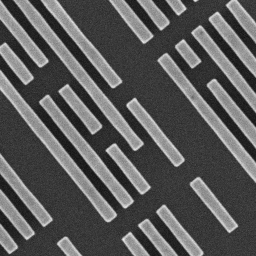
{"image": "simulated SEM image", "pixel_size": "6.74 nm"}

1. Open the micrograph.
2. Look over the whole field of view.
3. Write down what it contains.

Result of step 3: groups of lines, slits or small figures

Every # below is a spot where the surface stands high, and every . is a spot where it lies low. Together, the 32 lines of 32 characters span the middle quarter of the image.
.###....####............####...#
.####...####.............####...
..####...####.............####..
...####...####.............####.
....####...###..............###.
#....###....#...............####
##...####....................###
###...####....................##
####...####....................#
.####...####....###.............
.####...####....###.............
..####...####...####............
...####...####...####...........
#...####...####...####..........
#....####...####...####.........
##...####...####....###.........
###...###....####....###........
####..........####...####.......
.####..........####...####......
..####..........####...####.....
..####......#....###...####.....
...####....###...#......####....
#...####...####..........####...
##...####...####..........####..
###...####...####..........###..
###....####...####..............
####...####....###..............
.####...####...####.............
..####...####...####............
...####...####...####...........
....###....####...###...........
....####....###...###...........